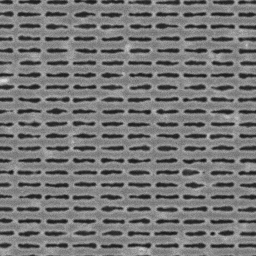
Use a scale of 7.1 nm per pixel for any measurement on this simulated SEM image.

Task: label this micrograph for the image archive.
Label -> a regular array of holes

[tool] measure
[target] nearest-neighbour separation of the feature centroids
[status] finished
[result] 84.7 nanometres